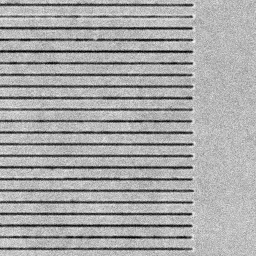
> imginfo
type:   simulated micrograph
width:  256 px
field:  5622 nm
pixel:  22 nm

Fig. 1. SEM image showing parallel lines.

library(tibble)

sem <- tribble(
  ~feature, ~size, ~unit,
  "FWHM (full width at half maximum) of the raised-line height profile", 198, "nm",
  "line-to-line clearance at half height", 60.4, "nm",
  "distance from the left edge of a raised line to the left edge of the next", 255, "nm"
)